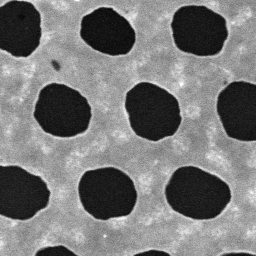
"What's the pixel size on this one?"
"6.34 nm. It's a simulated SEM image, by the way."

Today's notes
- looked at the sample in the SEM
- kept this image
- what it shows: holes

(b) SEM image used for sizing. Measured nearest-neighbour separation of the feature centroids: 572 nm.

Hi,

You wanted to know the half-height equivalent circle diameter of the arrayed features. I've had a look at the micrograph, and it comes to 352 nm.